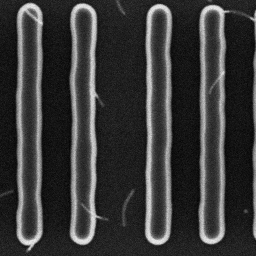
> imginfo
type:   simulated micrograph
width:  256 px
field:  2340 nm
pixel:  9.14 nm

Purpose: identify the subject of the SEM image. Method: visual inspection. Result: groups of lines, slits or small figures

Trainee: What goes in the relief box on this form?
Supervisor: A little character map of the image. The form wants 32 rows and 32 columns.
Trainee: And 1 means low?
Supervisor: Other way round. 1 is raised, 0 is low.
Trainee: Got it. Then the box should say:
00000000000000000000000000000000
00011000011100000001100000110000
00111000011100000001100001110000
00111000011100000001100001110000
00011000011100000001100001110000
00011000011100000001100001110000
00011000011100000001100001110000
00011000011100000001100001110000
00011000011100000001100001110000
00011000011100000001100001110000
00011000011100000001100001110000
00111000011100000001100001110000
00111000011100000001100001110000
00111000011100000001100001110000
00111000011100000001100001110000
00111000011100000001100001110000
00111000011100000001100001110000
00011000011100000001100001110000
00111000011100000001100001110000
00111000011100000001100001110000
00011000011100000001100001110000
00111000011100000001100001110000
00111000011100000001100001110000
00011000011100000001100001110000
00011000011100000001100001110000
00011000011100000001100001110000
00111000011100000001100001110000
00111000011100000001100001110000
00111000011100000001100001110000
00111000011000000001100001110000
00000000000000000000000000000000
00000000000000000000000000000000